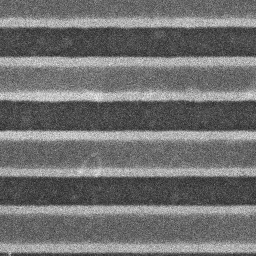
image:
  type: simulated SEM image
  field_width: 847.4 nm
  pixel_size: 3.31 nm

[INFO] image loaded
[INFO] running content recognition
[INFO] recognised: one or a few lines or trenches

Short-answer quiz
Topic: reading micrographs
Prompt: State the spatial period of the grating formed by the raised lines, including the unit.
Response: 74.9 pixels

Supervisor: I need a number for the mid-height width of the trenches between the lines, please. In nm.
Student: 121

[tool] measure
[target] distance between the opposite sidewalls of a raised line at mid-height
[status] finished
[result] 130 nm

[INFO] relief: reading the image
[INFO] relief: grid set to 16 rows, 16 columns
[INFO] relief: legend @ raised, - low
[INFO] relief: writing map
@@@@@@@@@@@@@@@@
---@------------
----------------
----------------
@@@@@@@@@@@@@@@@
@@@@@@@@@@@@@@@@
----------------
----------------
@@@@@@@@@@@@@@@@
@@@@@@@@@@@@@@@@
@@@@@@@@@@@@@@@@
----------------
----------------
@@@@@@@@@@@@@@@@
@@@@@@@@@@@@@@@@
@@@@@@@@@@@@@@@@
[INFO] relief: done